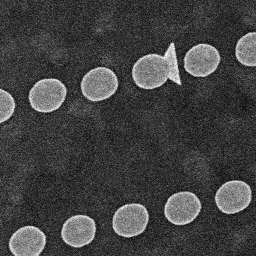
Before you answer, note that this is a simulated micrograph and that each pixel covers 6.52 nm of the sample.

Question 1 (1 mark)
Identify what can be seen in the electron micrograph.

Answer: a regular array of raised bodies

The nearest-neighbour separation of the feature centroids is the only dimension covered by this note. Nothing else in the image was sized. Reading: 342 nm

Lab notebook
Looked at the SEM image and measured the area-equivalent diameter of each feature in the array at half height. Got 223 nm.